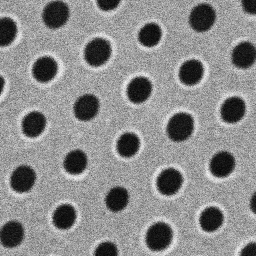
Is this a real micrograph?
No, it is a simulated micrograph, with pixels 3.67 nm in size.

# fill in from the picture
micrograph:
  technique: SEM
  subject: a regular array of holes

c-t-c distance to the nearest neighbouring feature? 203 nm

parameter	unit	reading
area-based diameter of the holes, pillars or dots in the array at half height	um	0.0909